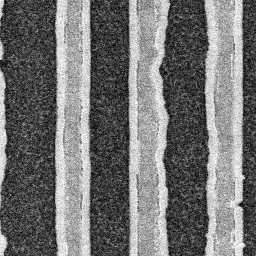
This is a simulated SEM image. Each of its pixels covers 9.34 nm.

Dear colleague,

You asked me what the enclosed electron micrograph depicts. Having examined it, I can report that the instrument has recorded one or a few lines or trenches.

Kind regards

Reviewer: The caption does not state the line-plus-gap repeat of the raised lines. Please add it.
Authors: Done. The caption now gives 709 nm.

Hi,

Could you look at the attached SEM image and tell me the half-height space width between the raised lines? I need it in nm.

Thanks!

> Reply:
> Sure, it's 461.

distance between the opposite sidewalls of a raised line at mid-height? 0.246 µm